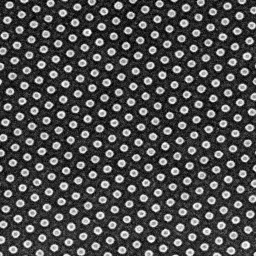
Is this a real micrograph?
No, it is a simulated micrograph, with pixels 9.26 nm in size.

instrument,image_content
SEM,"a regular array of raised bodies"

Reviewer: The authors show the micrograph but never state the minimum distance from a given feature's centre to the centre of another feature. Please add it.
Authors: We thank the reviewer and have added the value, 142 nm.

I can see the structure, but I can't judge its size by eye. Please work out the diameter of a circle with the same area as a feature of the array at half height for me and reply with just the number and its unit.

63.6 nm